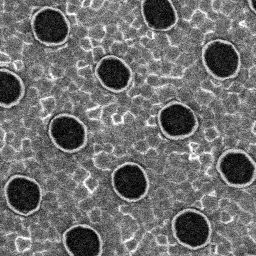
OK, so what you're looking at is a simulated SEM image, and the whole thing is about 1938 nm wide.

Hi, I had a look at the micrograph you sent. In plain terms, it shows a regular array of raised bodies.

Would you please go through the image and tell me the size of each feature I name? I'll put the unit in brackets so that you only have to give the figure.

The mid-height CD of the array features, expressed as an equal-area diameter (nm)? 279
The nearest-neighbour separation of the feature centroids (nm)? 574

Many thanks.